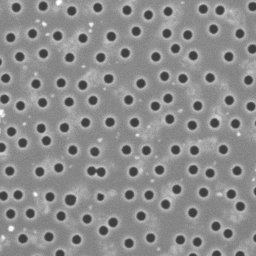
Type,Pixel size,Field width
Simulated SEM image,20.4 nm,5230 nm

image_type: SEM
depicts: a regular array of holes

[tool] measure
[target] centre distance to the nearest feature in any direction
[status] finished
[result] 414 nm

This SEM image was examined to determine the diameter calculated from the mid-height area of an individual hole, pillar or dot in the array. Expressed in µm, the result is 0.197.